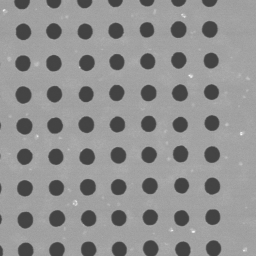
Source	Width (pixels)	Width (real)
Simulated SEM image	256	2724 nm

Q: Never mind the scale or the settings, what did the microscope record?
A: a regular array of holes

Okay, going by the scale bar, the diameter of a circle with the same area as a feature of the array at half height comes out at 0.169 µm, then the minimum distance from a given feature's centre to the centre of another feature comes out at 327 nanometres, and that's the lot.